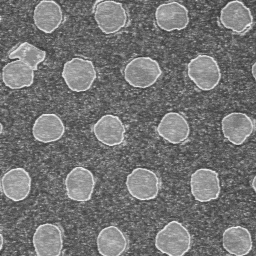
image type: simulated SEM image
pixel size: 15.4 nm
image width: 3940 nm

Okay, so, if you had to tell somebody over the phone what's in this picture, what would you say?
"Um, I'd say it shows a regular array of raised bodies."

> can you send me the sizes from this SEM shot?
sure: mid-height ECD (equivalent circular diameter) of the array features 0.468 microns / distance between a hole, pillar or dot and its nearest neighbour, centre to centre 958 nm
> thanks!